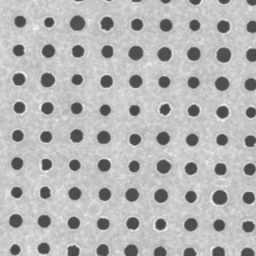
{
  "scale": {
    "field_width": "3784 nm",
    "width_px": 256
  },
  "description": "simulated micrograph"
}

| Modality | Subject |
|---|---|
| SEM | a regular array of holes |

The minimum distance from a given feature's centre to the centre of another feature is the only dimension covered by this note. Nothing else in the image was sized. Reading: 413 nanometers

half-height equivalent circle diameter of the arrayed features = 12.9 px